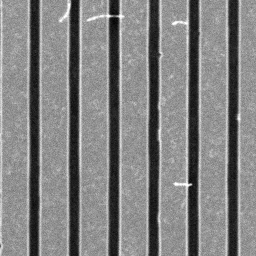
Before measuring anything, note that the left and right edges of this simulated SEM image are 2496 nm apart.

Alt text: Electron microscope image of parallel lines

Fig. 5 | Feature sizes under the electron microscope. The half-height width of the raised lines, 274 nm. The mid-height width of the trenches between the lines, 11.1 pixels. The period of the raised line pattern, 387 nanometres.